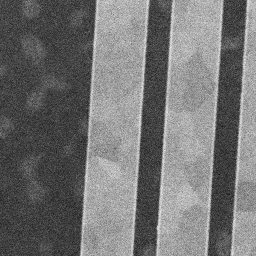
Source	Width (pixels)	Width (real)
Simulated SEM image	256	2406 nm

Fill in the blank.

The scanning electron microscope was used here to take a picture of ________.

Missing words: one or a few lines or trenches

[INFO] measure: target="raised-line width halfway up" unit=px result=50.4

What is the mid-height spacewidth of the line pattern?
233 nanometers